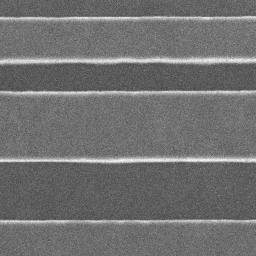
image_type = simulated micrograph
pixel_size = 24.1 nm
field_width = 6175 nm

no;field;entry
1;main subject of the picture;lines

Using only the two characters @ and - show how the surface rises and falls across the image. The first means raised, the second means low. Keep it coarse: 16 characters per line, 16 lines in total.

----------------
@@@@@@@@@@@@@@@@
@@@@@@@@@@@@@@@@
@@@@@@@@@@@@@@@@
----------------
----------------
@@@@@@@@@@@@@@@@
@@@@@@@@@@@@@@@@
@@@@@@@@@@@@@@@@
@@@@@@@@@@@@@@@@
----------------
----------------
----------------
----------------
@@@@@@@@@@@@@@@@
@@@@@@@@@@@@@@@@